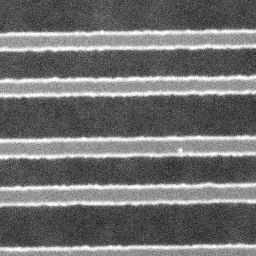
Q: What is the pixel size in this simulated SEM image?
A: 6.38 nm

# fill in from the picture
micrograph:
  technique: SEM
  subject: lines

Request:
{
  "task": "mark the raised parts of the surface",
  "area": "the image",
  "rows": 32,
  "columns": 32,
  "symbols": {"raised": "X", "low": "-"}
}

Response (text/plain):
--------------------------------
--------------------------------
--------------------------------
--------------------------------
XXXXXXXXXXXXXXXXXXXXXXXXXXXXXXXX
XXXXXXXXXXXXXXXXXXXXXXXXXXXXXXXX
--------------------------------
--------------------------------
--------------------------------
--------------------------------
XXXXXXXXXXXXXXXXXXXXXXXXXXXXXXXX
XXXXXXXXXXXXXXXXXXXXXXXXXXXXXXXX
--------------------------------
--------------------------------
--------------------------------
--------------------------------
--------------------------------
-----XXXXXXXXXXXXXXXXXXXXXXXXXXX
XXXXXXXXXXXXXXXXXXXXXXXXXXXXXXXX
XXXXXXXXXXXXX--X----------------
--------------------------------
--------------------------------
--------------------------------
--XXXXXXXXXXXXXXXXXXXXXXXXXXXXXX
XXXXXXXXXXXXXXXXXXXXXXXXXXXXXXXX
XXXXXXXXX-----------------------
--------------------------------
--------------------------------
--------------------------------
--------------------------------
--------------------------------
XXXXXXXXXXXXXXXXXXXXXXXXXXXXXXXX